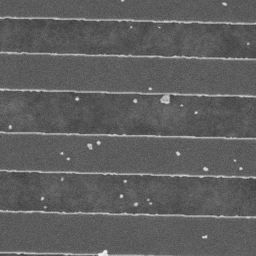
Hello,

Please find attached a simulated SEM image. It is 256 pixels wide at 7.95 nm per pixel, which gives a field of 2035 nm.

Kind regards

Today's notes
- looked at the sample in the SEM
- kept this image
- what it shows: lines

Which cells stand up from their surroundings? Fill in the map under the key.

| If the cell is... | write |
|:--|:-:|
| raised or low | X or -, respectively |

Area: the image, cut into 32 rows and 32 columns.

XXXXXXXXXXXXXXXXXXXXXXXXXXXXXXXX
XXXXXXXXXXXXXXXXXXXXXXXXXXXXXXXX
--------------XXXXXXXXXXXXXXXXXX
--------------------------------
--------------------------------
--------------------------------
X-------------------------------
XXXXXXXXXXXXXXXXXXXXXXXXXXXXXXXX
XXXXXXXXXXXXXXXXXXXXXXXXXXXXXXXX
XXXXXXXXXXXXXXXXXXXXXXXXXXXXXXXX
XXXXXXXXXXXXXXXXXXXXXXXXXXXXXXXX
------------XXXXXXXXXXXXXXXXXXXX
--------------------X-----------
--------------------------------
--------------------------------
--------------------------------
--------------------------------
XXXXXXXXXXXXXXXXXXXXXXXXXXXXXXXX
XXXXXXXXXXXXXXXXXXXXXXXXXXXXXXXX
XXXXXXXXXXXXXXXXXXXXXXXXXXXXXXXX
XXXXXXXXXXXXXXXXXXXXXXXXXXXXXXXX
---XXXXXXXXXXXXXXXXXXXXXXXXXXXXX
--------------------------------
--------------------------------
--------------------------------
--------------------------------
XXXXXX--------------------------
XXXXXXXXXXXXXXXXXXXXXXXXXXXXXXXX
XXXXXXXXXXXXXXXXXXXXXXXXXXXXXXXX
XXXXXXXXXXXXXXXXXXXXXXXXXXXXXXXX
XXXXXXXXXXXXXXXXXXXXXXXXXXXXXXXX
XXXXXXXXXXXXXXXXXXXXXXXXXXXXXXXX